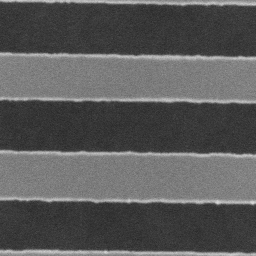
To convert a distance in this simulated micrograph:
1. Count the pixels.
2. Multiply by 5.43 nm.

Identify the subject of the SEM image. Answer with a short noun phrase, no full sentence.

lines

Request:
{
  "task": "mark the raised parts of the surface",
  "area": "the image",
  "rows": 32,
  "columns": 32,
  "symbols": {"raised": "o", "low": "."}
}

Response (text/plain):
...................ooooooooooooo
................................
................................
................................
................................
................................
................................
oooooooooooooooooooooooooooooooo
oooooooooooooooooooooooooooooooo
oooooooooooooooooooooooooooooooo
oooooooooooooooooooooooooooooooo
oooooooooooooooooooooooooooooooo
.ooo.ooooooooooooooooooooooooooo
................................
................................
................................
................................
................................
................................
oooooooooooooooooooooooooooooooo
oooooooooooooooooooooooooooooooo
oooooooooooooooooooooooooooooooo
oooooooooooooooooooooooooooooooo
oooooooooooooooooooooooooooooooo
oooooooooooooooooooooooooooooooo
...............................o
................................
................................
................................
................................
................................
oooooooooooooooo................